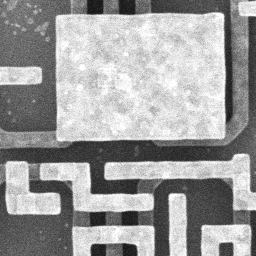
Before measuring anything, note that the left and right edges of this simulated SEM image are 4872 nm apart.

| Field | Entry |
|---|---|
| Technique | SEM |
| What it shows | wiring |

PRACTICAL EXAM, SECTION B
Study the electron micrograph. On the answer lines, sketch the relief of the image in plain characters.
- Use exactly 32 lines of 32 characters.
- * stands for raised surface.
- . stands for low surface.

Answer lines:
..............................**
..............................**
.......*********************....
.......*********************....
.......*********************....
.......*********************....
.......*********************....
.......*********************....
*****..*********************....
*****..*********************....
*......*********************....
.......*********************....
.......*********************....
.......*********************....
.......*********************....
.......*********************....
.......*********************....
.......*******..................
................................
.............................**.
.**....****..******************.
.***.******..******************.
.***.*.****..................**.
.***.....**..................**.
.******..**********..**......***
.******..**********..**......***
.******..............**.........
.....................**.........
.........**********..**..******.
.........**********..**..******.
.........***....***..**..***.**.
.........**......**..**..**..**.